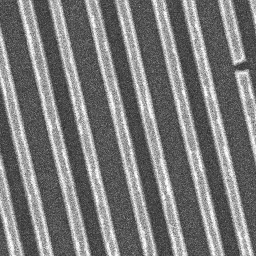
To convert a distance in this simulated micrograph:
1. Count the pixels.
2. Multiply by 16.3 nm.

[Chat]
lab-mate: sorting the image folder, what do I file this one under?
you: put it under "parallel lines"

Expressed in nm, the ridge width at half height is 176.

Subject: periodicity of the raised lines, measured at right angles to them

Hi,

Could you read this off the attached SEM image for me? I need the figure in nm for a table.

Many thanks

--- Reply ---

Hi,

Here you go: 528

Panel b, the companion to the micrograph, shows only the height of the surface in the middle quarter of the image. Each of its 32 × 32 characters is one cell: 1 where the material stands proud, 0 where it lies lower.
11100000011100000110000000111000
11100000001110000111000000111000
01100000001110000111000000111000
01100000001110000111000000011100
01110000001110000111000000011100
01110000000110000011100000011100
00110000000111000011100000011100
00110000000111000011100000001110
00110000000111000011100000001110
00111000000111000001110000001110
00111000000011100001110000001110
00111000000011100001110000000110
00011000000011100001110000000111
00011100000011100000110000000111
00011100000001110000111000000111
00011100000001110000111000000111
00001100000001110000111000000011
00001110000001110000111000000011
00001110000000110000011100000011
00001110000000111000011100000011
00000110000000111000011100000001
00000110000000111000011100000001
10000111000000111000001110000001
10000111000000011100001110000001
10000111000000011100001110000000
10000011000000011100000110000000
11000011100000011100000110000000
11000011100000001110000111000000
11000011100000001110000111000000
11000001100000001110000111000000
11000001110000001110000011000000
11100001110000000110000011100000